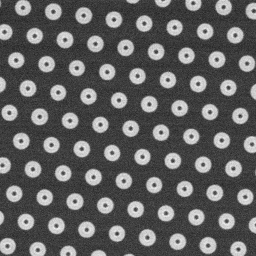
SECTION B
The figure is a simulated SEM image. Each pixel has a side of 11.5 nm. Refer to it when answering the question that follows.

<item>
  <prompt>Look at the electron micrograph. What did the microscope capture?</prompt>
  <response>an array of small figures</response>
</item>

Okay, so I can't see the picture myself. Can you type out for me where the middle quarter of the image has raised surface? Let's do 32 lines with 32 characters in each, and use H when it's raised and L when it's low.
LHHHHLLLLHHHLLLLLLLLLLLLLLLLLLLL
LHHHHLLLLHHHHLLLLHHHLLLLLLLLLLLL
LLHHLLLLLHHHHLLLHHHHLLLLLHHLLLLL
LLLLLLLLLLHHLLLLHHHHLLLLHHHHLLLL
LLLLLLLLLLLLLLLLLHHHLLLLHHHHLLLL
LLLLLLLLLLLLLLLLLLLLLLLLLHHLLLLL
LLLLLHHLLLLLLLLLLLLLLLLLLLLLLLLL
LLLLHHHHLLLLLHHLLLLLLLLLLLLLLLLL
LLLLHHHHLLLLHHHHLLLLHHHLLLLLLLLL
LLLLLHHLLLLLHHHHLLLHHHHLLLLLHHLL
LLLLLLLLLLLLLHHLLLLHHHHLLLLHHHHL
LLLLLLLLLLLLLLLLLLLLHHHLLLLHHHHL
LHLLLLLLLLLLLLLLLLLLLLLLLLLLHHLL
HHHLLLLLHHLLLLLLLLLLLLLLLLLLLLLL
HHHLLLLHHHHLLLLLHHLLLLLLLLLLLLLL
HHHLLLLHHHHLLLLHHHHLLLLHHLLLLLLL
LLLLLLLLHHHLLLLHHHHLLLHHHHLLLLLH
LLLLLLLLLLLLLLLHHHLLLLHHHHLLLLHH
LLLLLLLLLLLLLLLLLLLLLLLHHHLLLLHH
LLLLHLLLLLLLLLLLLLLLLLLLLLLLLLHH
LLLHHHLLLLLHHLLLLLLLLLLLLLLLLLLL
LLLHHHLLLLHHHHLLLLLHLLLLLLLLLLLL
LLLHHHLLLLHHHHLLLLHHHLLLLLHHLLLL
LLLLLLLLLLLHHHLLLLHHHLLLLHHHHLLL
LLLLLLLLLLLLLLLLLLHHHLLLLHHHHLLL
HLLLLLLLLLLLLLLLLLLLLLLLLLHHHLLL
HHLLLLHHLLLLLLLLLLLLLLLLLLLLLLLL
HHLLLHHHHLLLLLHHLLLLLLLLLLLLLLLL
HLLLLHHHHLLLLHHHHLLLLLHLLLLLLLLL
LLLLLLHHHLLLLHHHHLLLLHHHLLLLLHHL
LLLLLLLLLLLLLHHHLLLLLHHHLLLLHHHH
LLLLLLLLLLLLLLLLLLLLLHHHLLLLHHHH